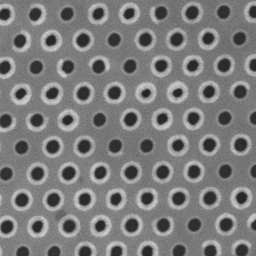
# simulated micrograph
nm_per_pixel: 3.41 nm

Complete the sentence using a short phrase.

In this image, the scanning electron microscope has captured a regular array of holes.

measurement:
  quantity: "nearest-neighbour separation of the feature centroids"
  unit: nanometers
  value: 104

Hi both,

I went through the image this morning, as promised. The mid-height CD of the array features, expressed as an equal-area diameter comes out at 46.7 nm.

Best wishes